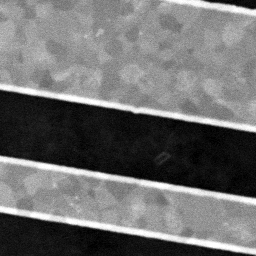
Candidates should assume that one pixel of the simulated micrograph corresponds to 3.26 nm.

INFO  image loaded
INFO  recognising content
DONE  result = one or a few lines or trenches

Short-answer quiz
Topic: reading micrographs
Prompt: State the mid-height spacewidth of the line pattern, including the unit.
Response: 227 nm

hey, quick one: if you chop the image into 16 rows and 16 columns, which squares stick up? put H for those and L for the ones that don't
HHHHHHHHHHHHHHLL
HHHHHHHHHHHHHHHH
HHHHHHHHHHHHHHHH
HHHHHHHHHHHHHHHH
HHHHHHHHHHHHHHHH
HHHHHHHHHHHHHHHH
LLLLLLHHHHHHHHHH
LLLLLLLLLLLLHHHH
LLLLLLLLLLLLLLLL
LLLLLLLLLLLLLLLL
HHHHLLLLLLLLLLLL
HHHHHHHHHHLLLLLL
HHHHHHHHHHHHHHHH
LLHHHHHHHHHHHHHH
LLLLLLLLHHHHHHHH
LLLLLLLLLLLLLLHH